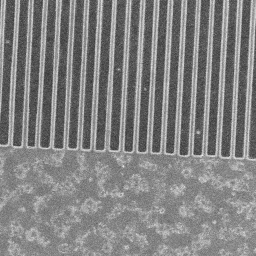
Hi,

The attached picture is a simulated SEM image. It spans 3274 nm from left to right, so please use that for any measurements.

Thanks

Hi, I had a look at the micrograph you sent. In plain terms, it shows parallel lines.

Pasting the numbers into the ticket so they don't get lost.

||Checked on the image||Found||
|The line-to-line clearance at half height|9.86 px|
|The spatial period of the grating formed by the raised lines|178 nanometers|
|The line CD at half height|4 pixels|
